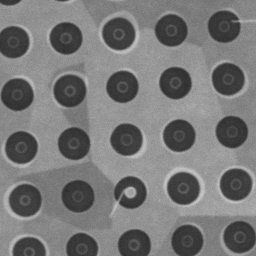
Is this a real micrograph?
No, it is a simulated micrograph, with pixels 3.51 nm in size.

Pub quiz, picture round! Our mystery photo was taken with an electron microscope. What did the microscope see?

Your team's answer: an array of small figures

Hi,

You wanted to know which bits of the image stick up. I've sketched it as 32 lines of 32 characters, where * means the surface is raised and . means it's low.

..******************************
***************************..***
*************....***...***....**
*..****...***....**....***....**
....**....***....**....***....**
....**....***....***...*********
...****..***********************
********************************
*********************..****...**
********..****...***....**.....*
*...***....**....***....***....*
....***....**....***....***...**
....***...****...***************
*..*****************************
********************************
***************.*****...***....*
**.*****...***....**....***....*
*....**....***....**....***....*
.....**....***....***...********
*...****...*****.***************
**.*****************************
**********************..****...*
***************...***....**.....
**...***....**....***....**.....
*....***....**....***....***...*
*....***....***...****..********
*....****.**********************
********************************
**********************...***....
***.*****..****....***...***....
**....**....***....**....***....
*.....**....***....***...****..*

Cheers